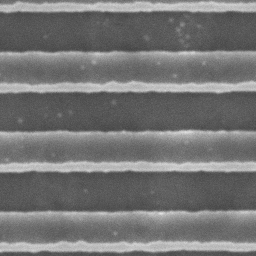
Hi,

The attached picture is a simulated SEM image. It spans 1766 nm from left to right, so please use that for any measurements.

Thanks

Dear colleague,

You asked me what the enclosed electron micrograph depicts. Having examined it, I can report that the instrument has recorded lines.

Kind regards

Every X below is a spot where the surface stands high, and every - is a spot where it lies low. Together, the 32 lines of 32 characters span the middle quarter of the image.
XXXXXXXXXXXXXXXXXXXXXXXXXXXXXXXX
XXXXXXXXXXXXXXXXXXXXXXXXXXXXXXXX
XXXXXXXXXXXXXXXXXXXXXXXXXXXXXXXX
XXXXXXXXXXXXXXXXXXXXXXXXXXXXXXXX
XXXXXXXXXXXXXXXXXXXXXXXXXXXXXXXX
XXXXXXXXXXXXXXXXXXXXXXXXXXXXXXXX
XXXXXXXXXXXXXXXXXXXXXXXXXXXXXXXX
--------------------------------
--------------------------------
--------------------------------
--------------------------------
--------------------------------
--------------------------------
--------------------------------
--------------------------------
--------------------------------
--------------------------------
XXXXXXXXXXXXXXXXXXXXXXXXXXXXXXXX
XXXXXXXXXXXXXXXXXXXXXXXXXXXXXXXX
XXXXXXXXXXXXXXXXXXXXXXXXXXXXXXXX
XXXXXXXXXXXXXXXXXXXXXXXXXXXXXXXX
XXXXXXXXXXXXXXXXXXXXXXXXXXXXXXXX
XXXXXXXXXXXXXXXXXXXXXXXXXXXXXXXX
XXXXXXXXXXXXXXXXXXXXXXXXXXXXXXXX
XXXXXXXXXXXXXXXXXXXXXXXXXXXXXXXX
XXXXXXXXXXXXXXXXXXXXXXXXXXXXXXXX
XXXXXXXXXXXXXXXX-XXXXXXXXXX-XXXX
--------------------------------
--------------------------------
--------------------------------
--------------------------------
--------------------------------